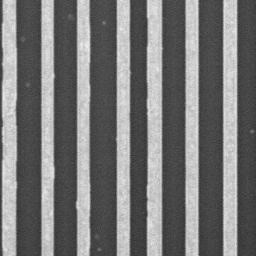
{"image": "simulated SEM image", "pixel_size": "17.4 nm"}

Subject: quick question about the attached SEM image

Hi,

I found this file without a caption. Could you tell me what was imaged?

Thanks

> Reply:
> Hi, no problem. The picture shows parallel lines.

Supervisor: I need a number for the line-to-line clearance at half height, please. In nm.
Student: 454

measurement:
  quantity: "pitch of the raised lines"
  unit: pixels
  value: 36.8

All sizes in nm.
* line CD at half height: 200